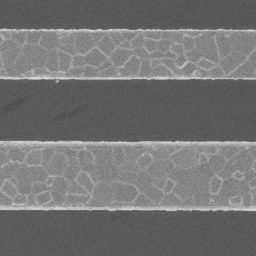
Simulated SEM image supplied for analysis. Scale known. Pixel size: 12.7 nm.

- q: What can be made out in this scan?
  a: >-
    lines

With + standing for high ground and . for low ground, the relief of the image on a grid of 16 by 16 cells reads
................
................
++++++++++++++++
++++++++++++++++
++++++++++++++++
................
................
................
................
++++++++++++++++
++++++++++++++++
++++++++++++++++
++++++++++++++++
................
................
................